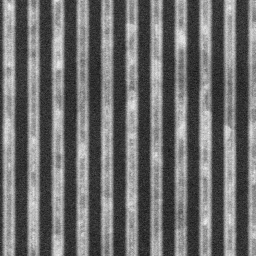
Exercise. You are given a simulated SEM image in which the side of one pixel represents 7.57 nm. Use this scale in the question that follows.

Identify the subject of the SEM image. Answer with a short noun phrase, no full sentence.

parallel lines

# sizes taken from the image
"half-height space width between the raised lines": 112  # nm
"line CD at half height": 71.9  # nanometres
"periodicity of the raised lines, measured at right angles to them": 186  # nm